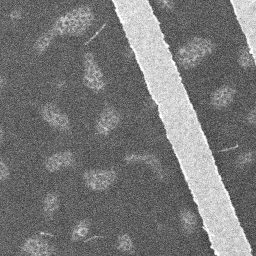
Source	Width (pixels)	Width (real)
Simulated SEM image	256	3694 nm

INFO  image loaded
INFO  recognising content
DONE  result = one or a few lines or trenches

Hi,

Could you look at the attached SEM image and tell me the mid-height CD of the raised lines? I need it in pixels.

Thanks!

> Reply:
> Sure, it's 32.6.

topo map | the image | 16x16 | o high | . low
.......oo......o
........oo.....o
........oo.....o
........ooo.....
.........oo.....
.........oo.....
..........oo....
..........oo....
...........oo...
...........oo...
...........ooo..
............oo..
............oo..
.............oo.
.............oo.
.............ooo